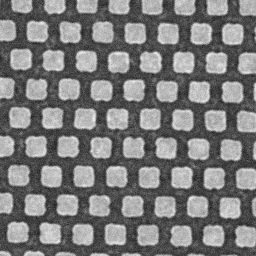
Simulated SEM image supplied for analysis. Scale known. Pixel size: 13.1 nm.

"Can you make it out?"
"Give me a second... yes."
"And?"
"a regular array of raised bodies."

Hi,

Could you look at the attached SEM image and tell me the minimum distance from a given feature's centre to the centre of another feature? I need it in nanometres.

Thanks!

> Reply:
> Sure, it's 423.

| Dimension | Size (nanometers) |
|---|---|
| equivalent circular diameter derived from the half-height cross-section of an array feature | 283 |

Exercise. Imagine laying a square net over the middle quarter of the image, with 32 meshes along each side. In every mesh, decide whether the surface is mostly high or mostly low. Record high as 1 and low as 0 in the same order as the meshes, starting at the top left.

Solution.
00011111000111110001111100001111
00001111000111110000111100001111
00000000000000000000000000000000
00000000000000000000000000000000
11100000111000011111000011000000
11110001111100011111000111110000
11110001111100011111000111110000
11110001111100011111000011110001
11100001111100011111000011110001
00000000000000000000000000000000
00000000000000000000000000000000
00011010000011100000111000000000
00011111000111110001111100011111
00011111000111110001111100011111
00011111000111110001111100011111
00011111000111110001111100011111
00000000000000000000000000000011
00000000000000000000000000000000
11100000001000001000000000000000
11100001111100011111000111110001
11100001111100011111000111110001
11110001111100011111000111110001
11100001111100011111000111110001
00000000000000000000000000100000
00000000000000000000000000000000
00000000000000000000000000000000
00011110000111100001111000011111
00011110000111110001111100011111
00011110000111110001111000011111
00011110000111110001111100011111
00000110000001100001111000001111
00000000000000000000000000000000